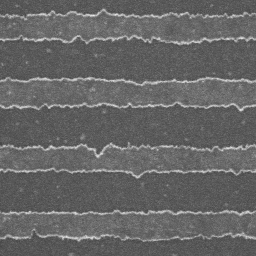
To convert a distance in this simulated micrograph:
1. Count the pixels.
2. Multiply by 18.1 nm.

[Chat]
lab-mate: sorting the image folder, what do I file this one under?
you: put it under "one or a few lines or trenches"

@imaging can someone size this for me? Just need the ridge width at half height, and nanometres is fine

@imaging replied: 452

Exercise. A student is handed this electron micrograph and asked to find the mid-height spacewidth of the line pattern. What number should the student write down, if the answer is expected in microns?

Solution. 0.736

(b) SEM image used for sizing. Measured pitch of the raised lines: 1190 nm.